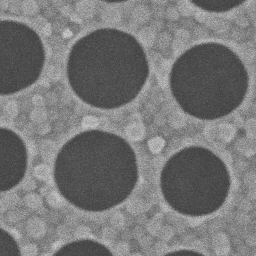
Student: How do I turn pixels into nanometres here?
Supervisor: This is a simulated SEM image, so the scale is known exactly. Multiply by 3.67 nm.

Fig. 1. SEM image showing holes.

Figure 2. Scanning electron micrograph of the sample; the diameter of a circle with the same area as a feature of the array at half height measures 292 nm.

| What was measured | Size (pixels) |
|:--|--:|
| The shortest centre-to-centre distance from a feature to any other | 101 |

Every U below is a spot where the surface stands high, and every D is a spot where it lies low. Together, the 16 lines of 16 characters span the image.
UUUUUUUUUUUUDDDU
DUUUUUUUUUUUUUUU
DDDUUDDDDUUUUUUU
DDDUDDDDDUUDDDDU
DDDUDDDDDUUDDDDU
DDUUDDDDDUUDDDDU
UUUUUDDDUUUDDDDU
UUUUUUUUUUUUUUUU
DUUUUDDUUUUUUUUU
DDUUDDDDUUUDDUUU
DDUDDDDDDUDDDDUU
DUUUDDDDUUDDDDUU
UUUUDDDDUUDDDDUU
UUUUUUUUUUUUDUUU
UUUUUUUUUUUUUUUU
DUUUDDDUUUUUUUUU